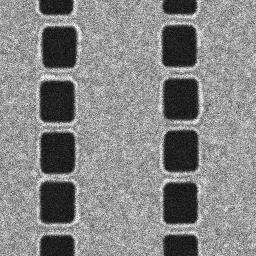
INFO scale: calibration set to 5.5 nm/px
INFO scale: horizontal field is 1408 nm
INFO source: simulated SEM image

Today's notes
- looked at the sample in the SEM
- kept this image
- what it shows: a regular array of holes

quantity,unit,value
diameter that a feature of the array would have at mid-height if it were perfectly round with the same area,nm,232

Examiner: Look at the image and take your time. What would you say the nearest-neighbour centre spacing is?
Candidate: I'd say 0.284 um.